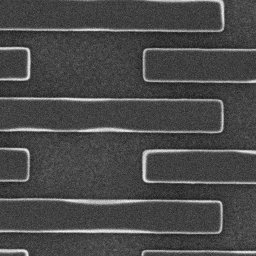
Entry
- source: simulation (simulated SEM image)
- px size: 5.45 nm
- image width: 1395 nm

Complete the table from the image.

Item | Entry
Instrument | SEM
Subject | groups of lines, slits or small figures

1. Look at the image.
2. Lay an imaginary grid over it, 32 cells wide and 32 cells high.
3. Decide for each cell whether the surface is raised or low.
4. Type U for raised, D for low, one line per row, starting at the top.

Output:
UUUUUUUUUUUUUUUUUUUUUUUUUUUUDDDD
UUUUUUUUUUUUUUUUUUUUUUUUUUUUDDDD
UUUUUUUUUUUUUUUUUUUUUUUUUUUUDDDD
UUUUUUUUUUUUUUUUUUUUUUUUUUUUDDDD
DDDDDDDDDDDDDDDDDDDDDDDDDDDDDDDD
DDDDDDDDDDDDDDDDDDDDDDDDDDDDDDDD
UUUUDDDDDDDDDDDDDDUUUUUUUUUUUUUU
UUUUDDDDDDDDDDDDDDUUUUUUUUUUUUUU
UUUUDDDDDDDDDDDDDDUUUUUUUUUUUUUU
UUUUDDDDDDDDDDDDDDUUUUUUUUUUUUUU
DDDDDDDDDDDDDDDDDDDDDDDDDDDDDDDD
DDDDDDDDDDDDDDDDDDDDDDDDDDDDDDDD
UUUUUUUUUUUUUUUUUUUUUUUUUUDDDDDD
UUUUUUUUUUUUUUUUUUUUUUUUUUUUDDDD
UUUUUUUUUUUUUUUUUUUUUUUUUUUUDDDD
UUUUUUUUUUUUUUUUUUUUUUUUUUUUDDDD
DDDDDDDDDDDDDDDDDDDDDDDDDUUDDDDD
DDDDDDDDDDDDDDDDDDDDDDDDDDDDDDDD
DDDDDDDDDDDDDDDDDDDDDDDDDDDDDDDD
UUUUDDDDDDDDDDDDDDUUUUUUUUUUUUUU
UUUUDDDDDDDDDDDDDDUUUUUUUUUUUUUU
UUUUDDDDDDDDDDDDDDUUUUUUUUUUUUUU
UUUDDDDDDDDDDDDDDDUUUUUUUUUUUUUU
DDDDDDDDDDDDDDDDDDDDDDDDDDDDDDDD
DDDDDDDDDDDDDDDDDDDDDDDDDDDDDDDD
UUUUUUUUUUUUUUUUUUUUUUUUUUUUDDDD
UUUUUUUUUUUUUUUUUUUUUUUUUUUUDDDD
UUUUUUUUUUUUUUUUUUUUUUUUUUUUDDDD
UUUUUUUUUUUUUUUUUUUUUUUUUUUUDDDD
DDDDDDDDDDDDDDDDDDDDDDDDDDDDDDDD
DDDDDDDDDDDDDDDDDDDDDDDDDDDDDDDD
UUUDDDDDDDDDDDDDDDUUUUUUUUUUUDDD